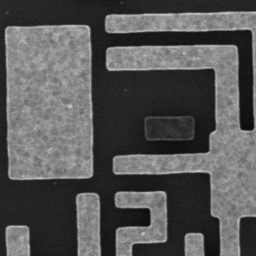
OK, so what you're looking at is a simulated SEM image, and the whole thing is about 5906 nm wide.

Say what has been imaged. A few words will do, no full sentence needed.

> wiring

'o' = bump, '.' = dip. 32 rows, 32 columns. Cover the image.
................................
................................
.............ooooooooooooooooooo
.oooooooooo..ooooooooooooooooooo
.oooooooooo.....................
.oooooooooo.....................
.oooooooooo..ooooooooooooooooo..
.oooooooooo..ooooooooooooooooo..
.oooooooooo..ooooooooooooooooo..
.oooooooooo................ooo..
.oooooooooo................ooo..
.oooooooooo................ooo..
.oooooooooo................ooo..
.oooooooooo................ooo..
.oooooooooo................ooo..
.oooooooooo.......oooooo...ooo..
.oooooooooo.......oooooo...ooooo
.oooooooooo........o.oo...oooooo
.oooooooooo...............oooooo
.oooooooooo....ooooooooooooooooo
.oooooooooo...oooooooooooooooooo
.ooooooooooo..oooooooooooooooooo
..........................oooooo
..........................oooooo
..........oo...oooooo.....oooooo
..........oo...oooooo.....oooooo
..........oo.......oo.....oooooo
..........oo.......oo......ooo..
.oo.......oo...oooooo.......oo..
.ooo......oo...oooooo..oo...oo..
.ooo......oo...oo......oo...oo..
.ooo......oo...o.......oo...oo..